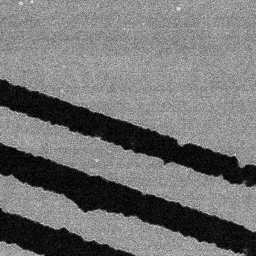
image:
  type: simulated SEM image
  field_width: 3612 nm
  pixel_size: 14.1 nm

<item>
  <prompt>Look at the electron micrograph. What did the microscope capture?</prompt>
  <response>one or a few lines or trenches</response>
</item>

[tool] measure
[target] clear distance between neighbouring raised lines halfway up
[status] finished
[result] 32.6 px